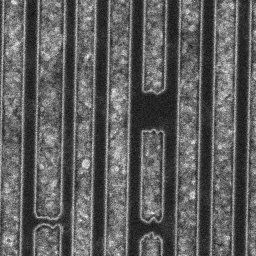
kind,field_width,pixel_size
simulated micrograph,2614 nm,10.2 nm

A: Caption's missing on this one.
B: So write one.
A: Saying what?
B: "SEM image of parallel lines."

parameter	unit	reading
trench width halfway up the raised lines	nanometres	212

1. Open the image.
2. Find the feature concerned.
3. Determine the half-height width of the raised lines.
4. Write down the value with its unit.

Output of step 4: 150 nanometers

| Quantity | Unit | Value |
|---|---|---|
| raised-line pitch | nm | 361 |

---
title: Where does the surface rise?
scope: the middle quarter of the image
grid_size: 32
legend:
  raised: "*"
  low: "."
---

***.....***.....****.....****...
***.....***.....****.....****...
***.....***.....****.....****...
***.....***.....****.....****...
***.....***.....****.....****...
***.....***.....****.....****...
***.....***.....****.....****...
***....****.....*************...
***....****.....*************...
***....****.....*************...
***....****.....*************...
***....****.....*************...
***....****.....*************...
***....****.....*************...
***....****.....*************...
***....****.....*************...
***....****.....************....
***....****.....****.....***....
***....****.....****.....***....
***....****.....****.....***....
***....****.....****.....***....
***....****.....****.....***....
***....****.....****.....***....
***....****.....****.....***....
***..*.****.....***......***....
***..*.****.....***......***....
***....****.....***......***....
***....****.....***......***....
***....****.....***......***....
***....****.....***......***....
***....****.....***......***....
**.....***......***......***....